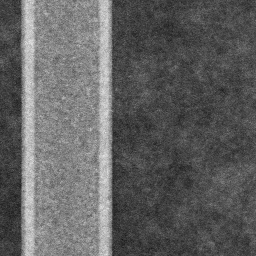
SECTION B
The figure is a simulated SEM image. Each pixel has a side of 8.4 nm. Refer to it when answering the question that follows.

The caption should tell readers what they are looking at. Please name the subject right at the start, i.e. one or a few lines or trenches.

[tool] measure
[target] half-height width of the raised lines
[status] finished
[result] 0.634 µm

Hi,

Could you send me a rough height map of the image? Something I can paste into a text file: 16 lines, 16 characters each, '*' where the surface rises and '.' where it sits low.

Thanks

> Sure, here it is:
..****..........
..****..........
..****..........
..****..........
..****..........
..****..........
..****..........
..*****.........
..*****.........
..*****.........
..*****.........
..*****.........
..*****.........
..*****.........
..*****.........
..*****.........